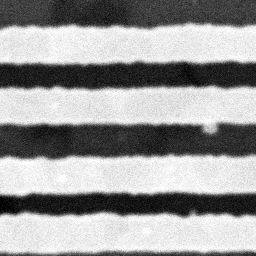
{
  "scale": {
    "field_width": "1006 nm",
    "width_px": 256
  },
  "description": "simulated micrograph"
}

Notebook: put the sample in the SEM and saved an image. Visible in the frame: lines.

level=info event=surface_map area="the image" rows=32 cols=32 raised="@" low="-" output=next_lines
--------------------------------
--------------------------------
--------------------------------
-@@@@-@@@@-@-@@@----@@@@@@@@@@@@
@@@@@@@@@@@@@@@@@@@@@@@@@@@@@@@@
@@@@@@@@@@@@@@@@@@@@@@@@@@@@@@@@
@@@@@@@@@@@@@@@@@@@@@@@@@@@@@@@@
@@@@@@@@@@@@@@@@@@@@@@@@@@@@@@@@
--------------------------------
--------------------------------
--------------------------------
@@@@@@@@@@@@@@@@@@@@@@@@@@@@@@@@
@@@@@@@@@@@@@@@@@@@@@@@@@@@@@@@@
@@@@@@@@@@@@@@@@@@@@@@@@@@@@@@@@
@@@@@@@@@@@@@@@@@@@@@@@@@@@@@@@@
--@@----------------------------
--------------------------------
--------------------------------
--------------------------------
--------------------------------
@@@@@@@@@@@@@@@@@@@@@@@@@@@@@@@@
@@@@@@@@@@@@@@@@@@@@@@@@@@@@@@@@
@@@@@@@@@@@@@@@@@@@@@@@@@@@@@@@@
@@@@@@@@@@@@@@@@@@@@@@@@@@@@@@@@
--------------------------------
--------------------------------
--------------------------------
@@@@@@@@@@@@@@@@@@@@@@@@@@@@@@@@
@@@@@@@@@@@@@@@@@@@@@@@@@@@@@@@@
@@@@@@@@@@@@@@@@@@@@@@@@@@@@@@@@
@@@@@@@@@@@@@@@@@@@@@@@@@@@@@@@@
----@@@-------------------------